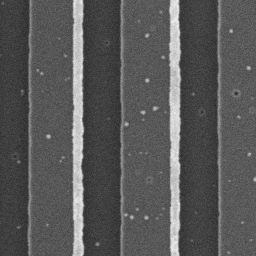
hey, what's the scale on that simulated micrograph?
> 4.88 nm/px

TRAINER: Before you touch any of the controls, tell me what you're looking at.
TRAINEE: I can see lines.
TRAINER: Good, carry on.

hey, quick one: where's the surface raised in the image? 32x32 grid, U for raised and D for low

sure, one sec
DDDDUUUUUUDDDDDUUUUUUUDDDDDUUUUU
DDDDUUUUUUDDDDDUUUUUUUDDDDDUUUUU
DDDDUUUUUUDDDDDUUUUUUUDDDDDUUUUU
DDDDUUUUUUDDDDDUUUUUUUDDDDDUUUUU
DDDDUUUUUUDDDDDUUUUUUUDDDDDUUUUU
DDDDUUUUUUDDDDDUUUUUUUDDDDDUUUUU
DDDDUUUUUUDDDDDUUUUUUUUDDDDUUUUU
DDDDUUUUUUDDDDDUUUUUUUDDDDDUUUUU
DDDDUUUUUUDDDDDUUUUUUUDDDDDUUUUU
DDDDUUUUUUDDDDDUUUUUUUUDDDDUUUUU
DDDDUUUUUUDDDDDUUUUUUUDDDDDUUUUU
DDDDUUUUUUDDDDDUUUUUUUDDDDDUUUUU
DDDDUUUUUUDDDDDUUUUUUUDDDDDUUUUU
DDDDUUUUUUDDDDDUUUUUUUDDDDDUUUUU
DDDDUUUUUUDDDDDUUUUUUUDDDDDUUUUU
DDDDUUUUUUDDDDDUUUUUUUUDDDDUUUUU
DDDDUUUUUUDDDDDUUUUUUUDDDDDUUUUU
DDDDUUUUUUDDDDDUUUUUUUDDDDDUUUUU
DDDDUUUUUUDDDDDUUUUUUUDDDDDUUUUU
DDDDUUUUUUDDDDDUUUUUUUDDDDDUUUUU
DDDDUUUUUUDDDDDUUUUUUUDDDDDUUUUU
DDDDUUUUUUDDDDDUUUUUUUDDDDDUUUUU
DDDDUUUUUUDDDDDUUUUUUUDDDDDUUUUU
DDDDUUUUUUDDDDDUUUUUUUDDDDDUUUUU
DDDDUUUUUUDDDDDUUUUUUUDDDDDUUUUU
DDDDUUUUUUDDDDDUUUUUUUDDDDDUUUUU
DDDDUUUUUUDDDDDUUUUUUUDDDDDUUUUU
DDDDUUUUUUDDDDDUUUUUUUDDDDDUUUUU
DDDDUUUUUUDDDDDUUUUUUUDDDDDUUUUU
DDDDUUUUUUDDDDDUUUUUUUDDDDDUUUUU
DDDDUUUUUUDDDDDUUUUUUUDDDDDUUUUU
DDDDUUUUUUDDDDDUUUUUUUDDDDDUUUUU